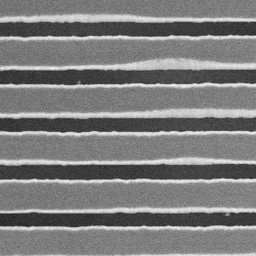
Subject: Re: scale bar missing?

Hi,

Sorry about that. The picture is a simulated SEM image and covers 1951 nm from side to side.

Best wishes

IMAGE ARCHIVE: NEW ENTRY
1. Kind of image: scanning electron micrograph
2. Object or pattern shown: lines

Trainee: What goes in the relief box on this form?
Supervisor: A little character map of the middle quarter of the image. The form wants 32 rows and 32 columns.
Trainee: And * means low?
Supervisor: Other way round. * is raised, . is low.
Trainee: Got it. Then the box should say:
**************************...***
................................
................................
................................
................................
********************************
********************************
********************************
********************************
********************************
********************************
********************************
********************************
................................
................................
................................
................................
********************************
********************************
********************************
********************************
********************************
********************************
********************************
********************************
................................
................................
................................
................................
********************************
********************************
********************************